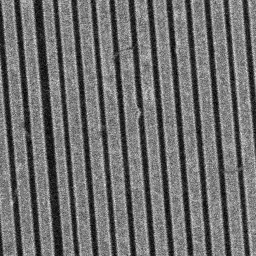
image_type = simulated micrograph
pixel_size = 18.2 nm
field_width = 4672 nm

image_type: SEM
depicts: parallel lines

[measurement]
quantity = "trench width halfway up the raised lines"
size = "7.72 px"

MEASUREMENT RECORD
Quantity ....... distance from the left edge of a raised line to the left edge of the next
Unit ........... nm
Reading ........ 345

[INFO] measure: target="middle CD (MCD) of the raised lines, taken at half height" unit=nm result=211